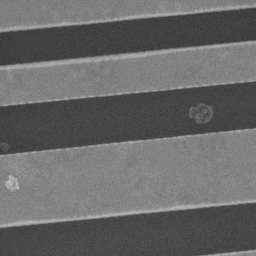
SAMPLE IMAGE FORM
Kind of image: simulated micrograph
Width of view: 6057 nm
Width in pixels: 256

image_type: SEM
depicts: lines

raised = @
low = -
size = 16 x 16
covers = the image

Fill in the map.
@@@@@@@@@@@@@@@-
@@@@@-----------
----------------
-------@@@@@@@@@
@@@@@@@@@@@@@@@@
@@@@@@@@@@@@----
@---------------
----------------
-----------@@@@@
--@@@@@@@@@@@@@@
@@@@@@@@@@@@@@@@
@@@@@@@@@@@@@@@@
@@@@@@@@@@@@@@@@
@@@@@@@---------
----------------
----------------